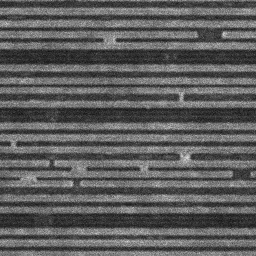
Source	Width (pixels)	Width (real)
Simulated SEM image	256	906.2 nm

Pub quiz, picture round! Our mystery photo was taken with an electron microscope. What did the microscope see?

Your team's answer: parallel lines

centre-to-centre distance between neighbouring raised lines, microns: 0.041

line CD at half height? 19.5 nm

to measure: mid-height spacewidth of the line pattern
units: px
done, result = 6.38